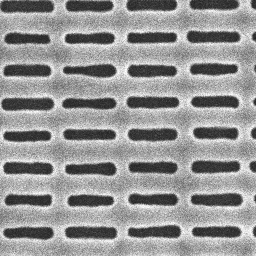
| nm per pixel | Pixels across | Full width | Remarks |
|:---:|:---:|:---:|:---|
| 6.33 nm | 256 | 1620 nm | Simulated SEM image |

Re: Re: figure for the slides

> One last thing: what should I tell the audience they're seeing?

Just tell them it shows a regular array of holes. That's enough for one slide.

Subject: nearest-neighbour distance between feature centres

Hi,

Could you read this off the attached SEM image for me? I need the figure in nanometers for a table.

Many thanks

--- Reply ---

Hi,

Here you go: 202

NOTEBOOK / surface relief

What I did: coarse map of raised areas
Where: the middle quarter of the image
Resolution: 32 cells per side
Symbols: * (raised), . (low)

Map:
***..........***............****
.............***............***.
*............***............****
*********..*********************
********************************
********************************
********************************
********************************
*.*******...****............****
.............***.............***
.............***.............***
********************************
********************************
********************************
********************************
********************************
............****............****
.............***.............***
.............***............****
********************************
********************************
********************************
********************************
********************************
***********.*****.*****....*****
.............***............****
.............***............****
*............**********....*****
********************************
********************************
********************************
********************************